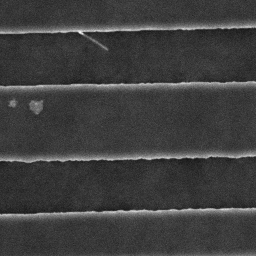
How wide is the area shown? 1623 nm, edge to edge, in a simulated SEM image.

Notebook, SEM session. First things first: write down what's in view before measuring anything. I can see lines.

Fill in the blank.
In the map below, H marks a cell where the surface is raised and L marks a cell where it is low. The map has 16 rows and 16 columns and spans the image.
HHHHHHHHHHHHHHHH
HHHHHHHHHHHHHHHH
LLLLLLLLLLLLLLLL
LLLLLLLLLLLLLLLL
LLLLLLLLLLLLLLLL
HHHHHHHHHHHHHHHH
HHHHHHHHHHHHHHHH
HHHHHHHHHHHHHHHH
HHHHHHHHHHHHHHHH
HHHHHHHHHHHHHHHH
LLLLLLLLLLLLLLLL
LLLLLLLLLLLLLLLL
LLLLLLLLLLLLLLLL
HHHHHHHHHHHHHHHH
HHHHHHHHHHHHHHHH
HHHHHHHHHHHHHHHH